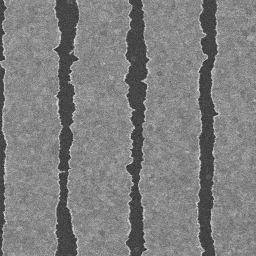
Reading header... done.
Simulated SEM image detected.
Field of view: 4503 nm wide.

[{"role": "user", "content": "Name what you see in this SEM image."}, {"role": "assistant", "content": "one or a few lines or trenches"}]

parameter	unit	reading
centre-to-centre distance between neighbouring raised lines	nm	1240